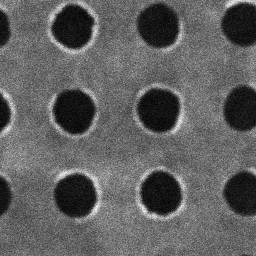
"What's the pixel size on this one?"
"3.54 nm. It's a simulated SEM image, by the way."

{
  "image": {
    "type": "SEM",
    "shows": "holes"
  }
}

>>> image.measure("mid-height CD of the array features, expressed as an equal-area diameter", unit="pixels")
43.9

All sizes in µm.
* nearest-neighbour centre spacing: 0.297